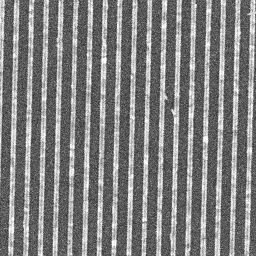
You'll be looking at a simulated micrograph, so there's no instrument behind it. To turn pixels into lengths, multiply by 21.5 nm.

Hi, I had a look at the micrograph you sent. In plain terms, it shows parallel lines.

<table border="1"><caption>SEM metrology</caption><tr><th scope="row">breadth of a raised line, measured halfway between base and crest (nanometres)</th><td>72.6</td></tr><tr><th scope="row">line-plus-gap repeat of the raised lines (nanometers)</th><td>317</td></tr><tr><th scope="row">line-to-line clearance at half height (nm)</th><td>239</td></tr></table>